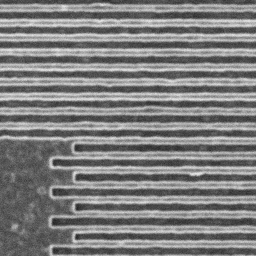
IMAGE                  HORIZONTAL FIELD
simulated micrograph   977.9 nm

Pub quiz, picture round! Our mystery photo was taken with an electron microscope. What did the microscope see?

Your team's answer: parallel lines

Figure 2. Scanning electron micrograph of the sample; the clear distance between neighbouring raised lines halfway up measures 30.5 nanometers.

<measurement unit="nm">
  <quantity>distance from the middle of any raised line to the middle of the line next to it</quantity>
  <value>56.3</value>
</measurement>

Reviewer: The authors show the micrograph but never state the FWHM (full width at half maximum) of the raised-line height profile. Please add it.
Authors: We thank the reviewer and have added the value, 23.9 nm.